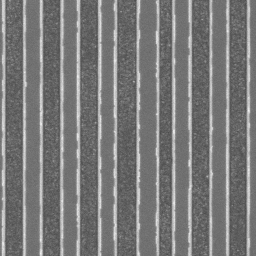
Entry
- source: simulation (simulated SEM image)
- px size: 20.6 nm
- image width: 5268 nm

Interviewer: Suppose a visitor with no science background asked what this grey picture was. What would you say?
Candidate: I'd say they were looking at parallel lines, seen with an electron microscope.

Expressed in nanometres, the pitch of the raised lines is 766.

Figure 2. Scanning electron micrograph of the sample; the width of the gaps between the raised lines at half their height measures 424 nm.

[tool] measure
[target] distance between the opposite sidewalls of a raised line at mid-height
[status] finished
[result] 352 nm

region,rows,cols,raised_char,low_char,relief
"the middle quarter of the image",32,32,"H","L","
HHHHLLLLLHHHHLLLLLLHHHHLLLLHHHHL
HHHHLLLLLHHHHLLLLLLHHHHLLLLHHHHL
HHHHLLLLLHHHHLLLLLLHHHHLLLLHHHHL
HHHHLLLLLHHHHLLLLLLHHHHLLLLHHHHL
HHHHLLLLLHHHHLLLLLLHHHHLLLLHHHHL
HHHHLLLLLHHHHLLLLLLHHHHLLLLHHHHL
HHHHLLLLLHHHHLLLLLLHHHHLLLLHHHHL
HHHHLLLLLHHHHLLLLLLHHHHLLLLHHHHL
HHHHLLLLLHHHHLLLLLLHHHHLLLLHHHHL
HHHHLLLLLHHHHLLLLLLHHHHLLLLHHHHL
HHHHLLLLLHHHHLLLLLLHHHHLLLLHHHHL
HHHHLLLLLHHHHLLLLLLHHHHLLLLHHHHL
HHHHLLLLLHHHHLLLLLLHHHHLLLLHHHHL
HHHHLLLLLHHHHLLLLLLHHHHLLLLHHHHL
HHHHLLLLLHHHHLLLLLLHHHHLLLLHHHHL
HHHHLLLLLHHHHLLLLLLHHHHLLLLHHHHL
HHHHLLLLLHHHHLLLLLLHHHHLLLLHHHHL
HHHHLLLLLHHHHLLLLLLHHHHLLLLHHHHL
HHHHLLLLLHHHHLLLLLLHHHHLLLLHHHHL
HHHHLLLLLHHHHLLLLLLHHHHLLLLHHHHL
HHHHLLLLLHHHHLLLLLLHHHHLLLLHHHHL
HHHHLLLLLHHHHLLLLLLHHHHLLLLHHHHL
HHHHLLLLLHHHHLLLLLLHHHHLLLLHHHHL
HHHHLLLLLHHHHLLLLLLHHHHHLLLLHHHL
HHHHLLLLLHHHHLLLLLLHHHHHLLLLHHHL
HHHHLLLLLHHHHLLLLLLHHHHHLLLHHHHL
HHHHLLLLLHHHHLLLLLLHHHHLLLLHHHHL
HHHHLLLLLHHHHLLLLLLHHHHHLLLHHHHL
HHHHLLLLLHHHHLLLLLHHHHHLLLLHHHHL
HHHHLLLLLHHHHLLLLLLHHHHLLLLHHHHL
HHHHLLLLLHHHHLLLLLLHHHHLLLLHHHHH
HHHHLLLLLHHHHLLLLLLHHHHLLLLHHHHH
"